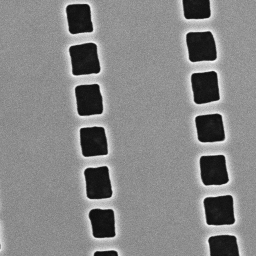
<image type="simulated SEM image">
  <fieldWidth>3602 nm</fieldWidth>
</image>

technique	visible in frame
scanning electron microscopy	a regular array of holes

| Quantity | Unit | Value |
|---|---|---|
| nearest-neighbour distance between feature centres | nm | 576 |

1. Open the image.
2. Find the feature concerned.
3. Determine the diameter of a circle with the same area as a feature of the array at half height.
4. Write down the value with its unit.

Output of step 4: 446 nm